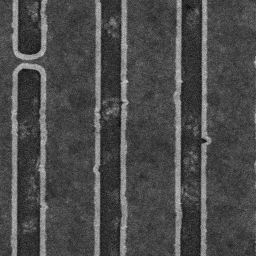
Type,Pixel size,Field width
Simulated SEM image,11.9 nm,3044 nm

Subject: one or a few lines or trenches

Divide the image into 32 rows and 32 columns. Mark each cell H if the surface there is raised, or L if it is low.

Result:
HHLLLLHHHHHHLLLLHHHHHHLLLLHHHHHH
HHLLLHHHHHHHLLLLHHHHHHLLLLHHHHHH
HHLLLHHHHHHHLLLLHHHHHHLLLLHHHHHH
HHLLLLHHHHHHLLLLHHHHHHLLLLHHHHHH
HHLLLLHHHHHHLLLLHHHHHHLLLLHHHHHH
HHLLLHHHHHHHLLLLHHHHHHLLLLHHHHHH
HHLLLHHHHHHHLLLLHHHHHHLLLLHHHHHH
HHHHHHHHHHHHLLLLHHHHHHLLLLHHHHHH
HHHLLHHHHHHHLLLLHHHHHHLLLLHHHHHH
HHLLLHHHHHHHLLLHHHHHHHLLLLHHHHHH
HHLLLHHHHHHHLLLLHHHHHHLLLLHHHHHH
HHLLLHHHHHHHLLLHHHHHHHLLLLHHHHHH
HHLLLHHHHHHHLLLHHHHHHHLLLLHHHHHH
HHLLLHHHHHHHLLLHHHHHHHLLLLHHHHHH
HHLLLHHHHHHHLLLHHHHHHHLLLLHHHHHH
HHLLLHHHHHHHLLLHHHHHHHLLLLHHHHHH
HHLLLHHHHHHHLLLHHHHHHHLLLHHHHHHH
HHLLLHHHHHHHLLLHHHHHHHLLLLHHHHHH
HHLLLHHHHHHHLLLHHHHHHHLLLHHHHHHH
HHLLLHHHHHHHLLLHHHHHHHLLLHHHHHHH
HHLLLHHHHHHHLLLHHHHHHHLLLHHHHHHH
HHLLLHHHHHHHLLLHHHHHHHLLLHHHHHHH
HHLLLHHHHHHHLLLHHHHHHHLLLHHHHHHH
HHLLLHHHHHHHLLLHHHHHHHLLLHHHHHHH
HHLLLHHHHHHHLLLHHHHHHHLLLHHHHHHH
HHLLLHHHHHHHLLLHHHHHHHLLLHHHHHHH
HHLLLHHHHHHHLLLLHHHHHHLLLHHHHHHH
HHLLLHHHHHHHLLLLHHHHHHLLLHHHHHHH
HHLLLHHHHHHHLLLHHHHHHHLLLHHHHHHH
HHLLLHHHHHHHLLLHHHHHHHLLLHHHHHHH
HHLLLHHHHHHHLLLHHHHHHHLLLHHHHHHH
HHLLLHHHHHHHLLLHHHHHHHLLLHHHHHHH